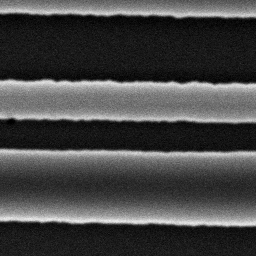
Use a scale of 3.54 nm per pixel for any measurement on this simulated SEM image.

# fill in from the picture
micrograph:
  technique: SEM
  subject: lines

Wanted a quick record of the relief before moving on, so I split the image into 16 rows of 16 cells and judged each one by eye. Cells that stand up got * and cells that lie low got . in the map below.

****************
................
................
................
................
****************
****************
****************
****************
****************
****************
****************
****************
****************
................
................